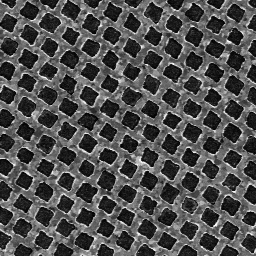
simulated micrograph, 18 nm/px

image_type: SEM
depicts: a regular array of holes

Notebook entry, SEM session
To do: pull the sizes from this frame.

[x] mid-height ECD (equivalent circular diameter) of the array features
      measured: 314 nm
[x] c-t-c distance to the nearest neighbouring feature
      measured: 420 nm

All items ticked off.